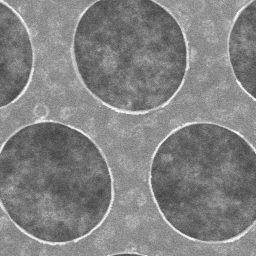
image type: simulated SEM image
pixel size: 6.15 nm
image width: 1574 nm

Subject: holes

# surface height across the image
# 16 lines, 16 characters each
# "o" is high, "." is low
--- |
.ooooo....ooooo.
.oooo......oooo.
..ooo.......oo..
..ooo.......oo..
..ooo.......ooo.
.oooo......oooo.
ooooooo...oooooo
oooooooooooooooo
o....oooooo....o
......oooo......
.......ooo......
.......oo.......
.......ooo......
o......ooo......
oo....ooooo....o
oooooooooooooooo